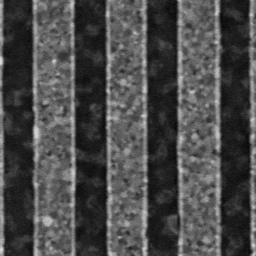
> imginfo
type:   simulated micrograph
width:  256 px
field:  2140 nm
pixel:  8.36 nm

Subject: one or a few lines or trenches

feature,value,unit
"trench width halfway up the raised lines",35.3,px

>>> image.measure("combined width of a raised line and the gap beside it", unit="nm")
605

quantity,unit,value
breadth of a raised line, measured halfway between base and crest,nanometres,310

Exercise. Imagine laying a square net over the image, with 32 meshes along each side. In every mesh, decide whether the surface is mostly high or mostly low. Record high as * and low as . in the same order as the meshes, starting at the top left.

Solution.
....*****.....****.....****....*
....*****.....****.....****....*
....*****.....****.....****....*
....*****.....****....*****....*
....*****.....****....*****....*
.....****.....****....*****....*
....*****.....****....*****....*
....*****.....****.....****.....
....*****.....****.....****.....
....*****.....****....*****.....
....*****.....****....*****.....
....*****.....****....*****.....
....*****.....****....*****.....
....*****.....****....*****.....
.....****.....****....*****.....
.....****.....****....*****.....
.....****.....****.....****.....
.....****.....****.....****.....
.....****.....****.....****.....
.....****.....****.....****.....
.....****.....****.....****.....
....*****.....****.....****.....
....*****.....****.....****.....
....*****.....****.....****.....
.....****.....****.....****.....
.....****.....****.....****.....
.....****.....****.....****.....
.....****.....****.....****.....
.....****.....****.....****.....
.....****.....****.....****.....
.....****.....****.....****.....
.....****.....****.....****.....